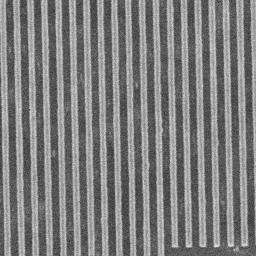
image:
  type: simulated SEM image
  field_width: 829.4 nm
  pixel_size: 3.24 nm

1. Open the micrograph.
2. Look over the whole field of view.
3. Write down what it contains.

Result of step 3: parallel lines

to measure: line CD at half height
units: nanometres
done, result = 16.2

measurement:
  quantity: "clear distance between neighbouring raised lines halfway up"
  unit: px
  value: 8.98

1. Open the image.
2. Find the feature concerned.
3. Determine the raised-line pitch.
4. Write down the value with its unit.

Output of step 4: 45.2 nm